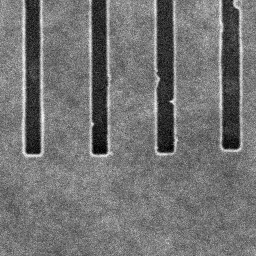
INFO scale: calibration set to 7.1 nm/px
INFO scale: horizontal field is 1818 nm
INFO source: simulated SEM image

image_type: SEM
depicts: one or a few lines or trenches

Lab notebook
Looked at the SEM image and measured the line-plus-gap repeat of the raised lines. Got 65.9 px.